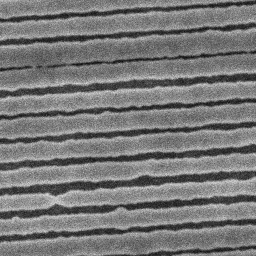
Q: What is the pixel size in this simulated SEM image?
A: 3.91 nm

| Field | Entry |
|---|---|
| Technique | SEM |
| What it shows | parallel lines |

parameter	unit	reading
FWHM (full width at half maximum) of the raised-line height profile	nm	71.7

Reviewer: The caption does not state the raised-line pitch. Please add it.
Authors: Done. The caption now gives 95.7 nanometres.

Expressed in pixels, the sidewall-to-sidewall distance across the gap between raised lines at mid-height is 6.37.